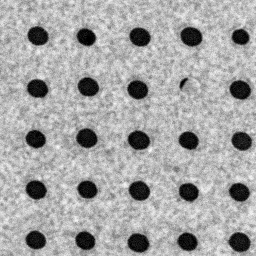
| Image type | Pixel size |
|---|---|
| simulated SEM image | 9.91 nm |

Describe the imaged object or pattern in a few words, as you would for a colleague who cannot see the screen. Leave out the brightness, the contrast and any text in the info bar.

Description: a regular array of holes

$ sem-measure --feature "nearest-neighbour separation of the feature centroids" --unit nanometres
493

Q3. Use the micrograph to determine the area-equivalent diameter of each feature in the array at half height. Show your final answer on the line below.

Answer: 204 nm